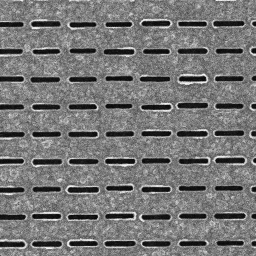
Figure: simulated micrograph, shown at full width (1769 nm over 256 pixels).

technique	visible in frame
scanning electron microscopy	a regular array of holes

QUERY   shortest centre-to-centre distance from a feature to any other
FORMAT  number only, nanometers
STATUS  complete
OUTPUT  187